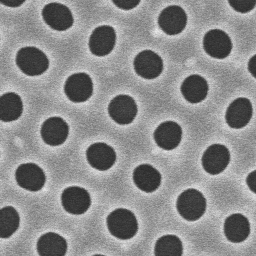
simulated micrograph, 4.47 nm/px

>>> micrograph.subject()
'a regular array of holes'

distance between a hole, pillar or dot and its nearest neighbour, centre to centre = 227 nanometers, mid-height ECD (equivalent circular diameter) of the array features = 134 nanometers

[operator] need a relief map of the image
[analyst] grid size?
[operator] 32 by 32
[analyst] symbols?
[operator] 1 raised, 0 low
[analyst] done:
00011100111111000111111111111000
11111000011111111111000111111101
11111000011111111111000111111111
11111100011100111111000111111111
11111111111000111111111110000111
11111111111000111111111110000111
11000111111000111001111111000111
11000011111111111000111111111110
11000011111111111000111111111110
11111111100111111000111101111111
11111111000011111111111000111111
11111111000011111111111000111111
00011111100111000111111001111001
00011111111110000111111111110000
00011111111111000111111111110000
11111000111111101111001111110001
11111000011111111110000111111111
11111000111111111110000111111111
11111111111000111111001111001111
11111111111000011111111110000111
11101111111000111111111110000111
11000111111111111000111111001110
11000011111111111000111111111110
11100111001111111000111111111110
11111111000111111111110001111111
11111111000111111111110000111111
00111111000111001111110000111111
00111111111110000111111001110001
00111111111110000111111111110001
01111000111111000111001111110001
11111000111111111110000111111111
11111000111111111110000111111111